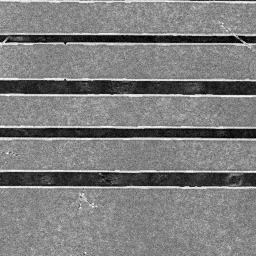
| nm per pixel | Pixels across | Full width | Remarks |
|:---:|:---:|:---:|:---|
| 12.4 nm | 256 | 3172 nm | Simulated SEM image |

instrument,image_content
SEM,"parallel lines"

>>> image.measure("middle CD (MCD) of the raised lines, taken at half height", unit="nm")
414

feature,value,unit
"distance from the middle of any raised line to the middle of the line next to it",568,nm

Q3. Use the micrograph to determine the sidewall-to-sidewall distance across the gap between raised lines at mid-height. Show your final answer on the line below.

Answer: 162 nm